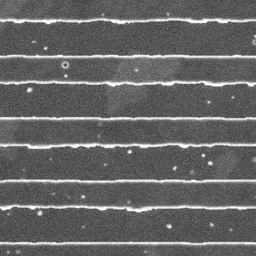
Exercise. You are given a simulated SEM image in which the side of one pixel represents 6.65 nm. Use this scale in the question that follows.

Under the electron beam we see lines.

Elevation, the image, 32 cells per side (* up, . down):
********************************
********************************
*********************.**********
................................
................................
................................
................................
********************************
********************************
********************************
..............*.**........***..*
................................
................................
................................
................................
********************************
********************************
********************************
................................
................................
................................
................................
..*.............................
********************************
********************************
********************************
................................
................................
................................
................................
********************************
********************************